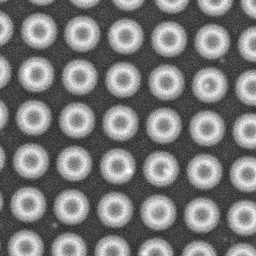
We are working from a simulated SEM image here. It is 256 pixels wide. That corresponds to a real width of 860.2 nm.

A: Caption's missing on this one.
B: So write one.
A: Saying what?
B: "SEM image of an array of small figures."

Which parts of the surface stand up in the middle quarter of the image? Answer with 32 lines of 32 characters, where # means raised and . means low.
.######.....#####.......###.....
########...#######.....######...
########...########...#######...
########...########..#########..
########...########..#########..
########...########..#########..
.######....#######....########..
...##.......#####.....#######...
........................####....
................................
.#####.......##.................
#######....######......####.....
#######...########....######....
#######...########...########...
########..########...########...
#######...########...########...
#######...########...########...
.#####.....#######...########...
............####......######....
.......................####.....
................................
#####.......###.................
######....######......####......
#######...#######....#######....
#######..#########..########....
#######..#########..########...#
#######..#########..#########..#
######....#######...########...#
#####.....#######....#######...#
............###......######.....
.......................##.......
................................